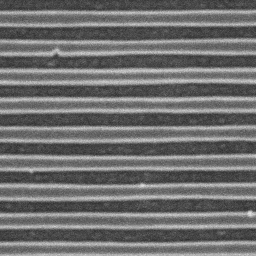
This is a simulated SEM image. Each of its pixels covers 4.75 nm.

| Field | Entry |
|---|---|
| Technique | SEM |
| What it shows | parallel lines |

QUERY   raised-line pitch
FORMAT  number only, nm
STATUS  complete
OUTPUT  137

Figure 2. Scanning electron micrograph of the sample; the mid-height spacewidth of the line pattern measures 68.8 nanometers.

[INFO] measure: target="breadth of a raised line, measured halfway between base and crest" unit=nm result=68.2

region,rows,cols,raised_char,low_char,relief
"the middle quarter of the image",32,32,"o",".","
................................
............................oooo
oooooooooooooooooooooooooooooooo
oooooooooooooooooooooooooooooooo
oooooooooooooooooooooooo........
................................
................................
................................
...............................o
oooooooooooooooooooooooooooooooo
oooooooooooooooooooooooooooooooo
oooooooooooooooooooooooooooooooo
................................
................................
................................
................................
oooooooooooooooooooooooooooooooo
oooooooooooooooooooooooooooooooo
oooooooooooooooooooooooooooooooo
..ooooo.........................
................................
................................
................................
oooooooooooooooooooooooooooooooo
oooooooooooooooooooooooooooooooo
oooooooooooooooooooooooooooooooo
................................
................................
................................
................................
oooooooooooooooooooooooooooooooo
oooooooooooooooooooooooooooooooo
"